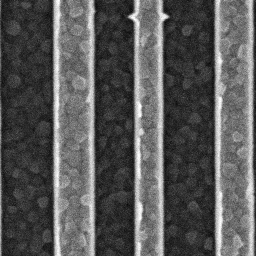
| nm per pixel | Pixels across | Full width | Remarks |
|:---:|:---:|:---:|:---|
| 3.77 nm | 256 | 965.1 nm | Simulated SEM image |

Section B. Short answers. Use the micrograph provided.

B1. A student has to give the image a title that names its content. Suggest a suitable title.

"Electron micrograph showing one or a few lines or trenches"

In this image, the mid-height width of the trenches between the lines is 0.202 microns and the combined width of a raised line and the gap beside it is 0.302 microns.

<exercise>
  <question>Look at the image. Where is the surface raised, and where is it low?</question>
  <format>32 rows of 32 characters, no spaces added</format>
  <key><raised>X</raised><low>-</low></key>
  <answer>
-------XXXXX-----XXX-------XXXX-
-------XXXXX-----XXX-------XXXX-
-------XXXXX-----XXX-------XXXX-
-------XXXXX-----XXX-------XXXX-
-------XXXXX-----XXX-------XXXX-
-------XXXXX-----XXX-------XXXX-
-------XXXXX-----XXX-------XXXX-
-------XXXXX-----XXX-------XXXX-
-------XXXXX-----XXX-------XXXX-
-------XXXXX-----XXX-------XXXX-
-------XXXXX-----XXX-------XXXX-
-------XXXXX-----XXX-------XXXX-
-------XXXXX-----XXX-------XXXX-
-------XXXXX-----XXX-------XXXX-
-------XXXXX-----XXX-------XXXX-
-------XXXXX-----XXX-------XXXX-
-------XXXXX-----XXX-------XXXX-
-------XXXXX-----XXX-------XXXX-
-------XXXXX-----XXX-------XXXX-
-------XXXXX-----XXX-------XXXX-
-------XXXXX-----XXX-------XXXX-
-------XXXXX-----XXX-------XXXX-
-------XXXXX-----XXX-------XXXX-
-------XXXXX-----XXX-------XXXXX
-------XXXXX-----XXX-------XXXXX
-------XXXXX-----XXX-------XXXXX
-------XXXXX-----XXX-------XXXXX
-------XXXXX-----XXX-------XXXXX
-------XXXXX-----XXX-------XXXXX
-------XXXXX-----XXX-------XXXXX
-------XXXXX-----XXX-------XXXXX
-------XXXXX-----XXX-------XXXXX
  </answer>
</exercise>